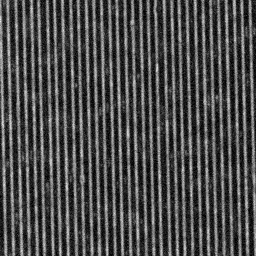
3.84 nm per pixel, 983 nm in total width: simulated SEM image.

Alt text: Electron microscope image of parallel lines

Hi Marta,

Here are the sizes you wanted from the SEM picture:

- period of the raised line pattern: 29.9 nm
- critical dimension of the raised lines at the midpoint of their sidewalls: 7.7 nm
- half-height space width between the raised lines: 20.6 nm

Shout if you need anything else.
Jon